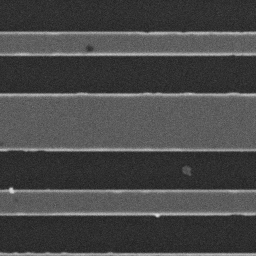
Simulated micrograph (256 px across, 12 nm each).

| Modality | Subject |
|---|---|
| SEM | lines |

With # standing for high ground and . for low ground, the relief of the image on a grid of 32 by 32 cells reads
................................
................................
................................
................................
################################
################################
################################
................................
................................
................................
................................
................................
################################
################################
################################
################################
################################
################################
################################
................................
................................
................................
................................
................................
################################
################################
################################
................................
................................
................................
................................
................................